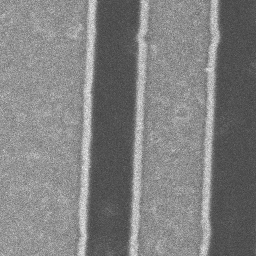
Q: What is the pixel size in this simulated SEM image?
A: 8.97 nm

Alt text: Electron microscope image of one or a few lines or trenches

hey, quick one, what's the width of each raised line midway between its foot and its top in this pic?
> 473 nm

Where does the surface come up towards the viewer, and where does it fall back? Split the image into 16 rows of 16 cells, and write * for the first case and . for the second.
......***....***
......***....***
......***....***
......***....***
......***....***
.....****....***
.....****....***
.....****....***
.....****....***
.....****....***
.....****....***
.....****....***
.....****....***
.....***.....***
.....***.....***
.....***.....***